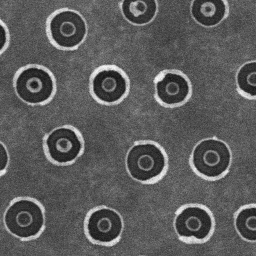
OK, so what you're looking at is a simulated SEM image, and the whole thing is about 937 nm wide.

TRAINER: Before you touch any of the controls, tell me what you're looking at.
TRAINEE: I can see a regular array of ring-shaped grooves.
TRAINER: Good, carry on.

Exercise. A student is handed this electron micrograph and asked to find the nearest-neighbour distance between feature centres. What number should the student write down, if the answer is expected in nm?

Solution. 242